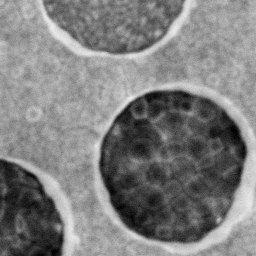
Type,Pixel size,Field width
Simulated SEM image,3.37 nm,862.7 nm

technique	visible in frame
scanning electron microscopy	holes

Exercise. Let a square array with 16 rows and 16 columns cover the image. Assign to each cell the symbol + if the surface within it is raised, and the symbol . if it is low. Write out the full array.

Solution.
+++.........++++
+++........+++++
+++++.....++++++
++++++++++++++++
++++++++++++++++
+++++++++++.++++
++++++++......++
+++++++........+
+++++++.........
++++++..........
.+++++..........
...+++.........+
...++++........+
....+++........+
....++++......++
....++++++++++++